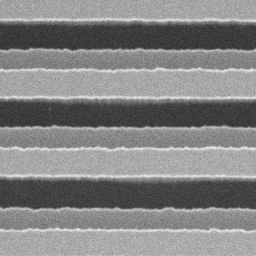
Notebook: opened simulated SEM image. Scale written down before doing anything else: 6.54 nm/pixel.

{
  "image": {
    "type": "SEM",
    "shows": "lines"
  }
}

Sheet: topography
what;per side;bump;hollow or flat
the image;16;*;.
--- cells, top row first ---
****************
................
................
****************
****************
****************
................
................
****************
****************
****************
................
................
****************
****************
****************